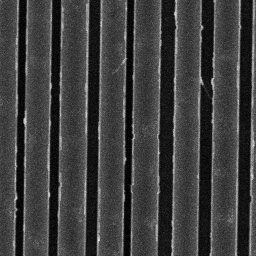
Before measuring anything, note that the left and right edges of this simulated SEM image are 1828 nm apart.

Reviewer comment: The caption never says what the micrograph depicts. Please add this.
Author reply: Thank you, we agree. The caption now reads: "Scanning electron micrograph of parallel lines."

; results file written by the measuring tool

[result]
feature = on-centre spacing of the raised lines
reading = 269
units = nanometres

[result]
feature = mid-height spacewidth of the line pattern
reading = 83.9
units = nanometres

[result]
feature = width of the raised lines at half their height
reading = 189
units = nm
